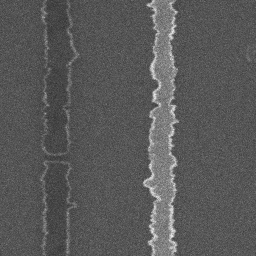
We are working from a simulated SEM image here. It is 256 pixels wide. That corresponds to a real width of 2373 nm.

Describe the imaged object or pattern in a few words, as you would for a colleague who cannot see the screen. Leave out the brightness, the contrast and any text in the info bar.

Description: one or a few lines or trenches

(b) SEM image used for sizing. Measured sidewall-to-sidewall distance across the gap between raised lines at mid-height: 770 nanometres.